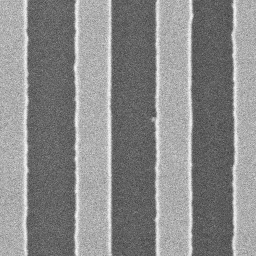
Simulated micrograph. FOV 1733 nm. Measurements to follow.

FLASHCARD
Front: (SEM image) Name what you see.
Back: lines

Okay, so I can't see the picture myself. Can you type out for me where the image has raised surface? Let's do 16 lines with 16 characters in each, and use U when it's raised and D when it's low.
UUDDDUUDDDUUDDDU
UUDDDUUDDDUUDDDU
UUDDDUUDDDUUDDDU
UUDDDUUDDDUUDDDU
UUDDDUUDDDUUDDDU
UUDDDUUDDDUUDDDU
UUDDDUUDDDUUDDDU
UUDDDUUDDDUUDDDU
UUDDDUUDDDUUDDDU
UUDDDUUDDDUUDDDU
UUDDDUUDDDUUDDDU
UUDDDUUDDDUUDDDU
UUDDDUUDDDUUDDDU
UUDDDUUDDDUUDDDU
UUDDDUUDDDUUDDDU
UUDDDUUDDDUUDDDU